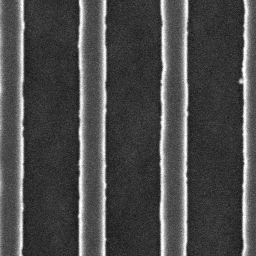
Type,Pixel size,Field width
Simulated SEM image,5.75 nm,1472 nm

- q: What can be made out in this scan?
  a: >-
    lines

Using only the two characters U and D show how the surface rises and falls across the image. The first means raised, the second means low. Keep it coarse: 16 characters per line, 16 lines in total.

UDDDDUUDDDUUDDDU
UDDDDUUDDDUUDDDU
UDDDDUUDDDUUDDDU
UDDDDUUDDDUUDDDU
UDDDDUUDDDUUDDDU
UDDDDUUDDDUUDDDU
UDDDDUUDDDUUDDDU
UDDDDUUDDDUUDDDU
UDDDDUUDDDUUDDDU
UDDDDUUDDDUUDDDU
UDDDDUUDDDUUDDDU
UDDDDUUDDDUUDDDU
UDDDDUUDDDUUDDDU
UDDDDUUDDDUUDDDU
UDDDDUUDDDUUDDDU
UDDDDUUDDDUUDDDU